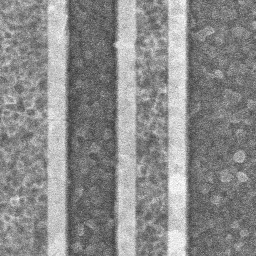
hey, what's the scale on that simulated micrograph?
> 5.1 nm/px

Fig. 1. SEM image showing one or a few lines or trenches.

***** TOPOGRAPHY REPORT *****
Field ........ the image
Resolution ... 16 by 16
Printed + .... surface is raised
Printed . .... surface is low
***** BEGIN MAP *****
++++....+++.....
++++....+++.....
++++....+++.....
++++....+++.....
++++....+++.....
++++....+++.....
++++....+++.....
++++....+++.....
++++....+++.....
++++....+++.....
++++....+++.....
++++....+++.....
++++....+++.....
++++....+++.....
++++....+++.....
+++.....+++.....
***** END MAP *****